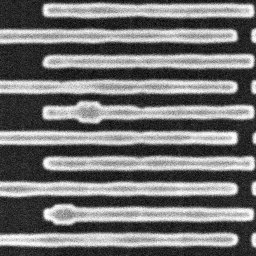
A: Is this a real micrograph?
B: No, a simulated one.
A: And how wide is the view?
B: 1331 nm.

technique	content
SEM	wiring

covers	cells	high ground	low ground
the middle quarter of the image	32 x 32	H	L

LLLHHHHHHHHHHHHHHHLLHHHHLLHHHHHH
LLLLLLLLLLLLLLLLLLLLLLLLLLLLLLLL
LLLLLLLLLLLLLLLLLLLLLLLLLLLLLLLL
LLLLLLLLLLLLLLLLLLLLLLLLLLLLLLLL
LLLLLLLLLLLLLLLLLLLLLLLLLLLLLLLL
HHHHHHHHHHHHHHHHHHHHHHHHHHHHHHHH
HHHHHHHHHHHHHHHHHHHHHHHHHHHHHHHH
LLLLLLLLLLLLLLLLLLLLLLLLLLLLLLLL
LLLLLLLLLLLLLLLLLLLLLLLLLLLLLLLL
LLLLLLLLLLLLLLLLLLLLLLLLLLLLLLLL
LLLHHHHHHLLLLLLLLLLLLLLLLLLLLLLL
HHHHHHHHHHHHHHHHHHHHHHHHHHHHHHHH
HHHHHHHHHHHHHHHHHHHHHHHHHHHHHHHH
LLLLHHHHHLLLLLLLLLLLLLLLLLLLLLLL
LLLLLLLLLLLLLLLLLLLLLLLLLLLLLLLL
LLLLLLLLLLLLLLLLLLLLLLLLLLLLLLLL
LLLLLLLLLLLLLLLLLLLLLLLLLLLLLLLL
HHHHHHHHHHHHHHHHHHHLHHHHHHHHHHHH
HHHHHHHHHHHHHHHHHHHHHHHHHHHHHHHH
HHHHHHHHHHHHHHHHHHLLHHHHHHHHHHHH
LLLLLLLLLLLLLLLLLLLLLLLLLLLLLLLL
LLLLLLLLLLLLLLLLLLLLLLLLLLLLLLLL
LLLLLLLLLLLLLLLLLLLLLLLLLLLLLLLL
LLLLLLLLLLLLLLLLLLLLLLLLLLLLLLLL
HHHHHHHHHHHHHHHHHHHHHHHHHHHHHHHH
HHHHHHHHHHHHHHHHHHHHHHHHHHHHHHHH
LLLLLLLLLLLLLLLLLLLLLLLLLLLLLLLL
LLLLLLLLLLLLLLLLLLLLLLLLLLLLLLLL
LLLLLLLLLLLLLLLLLLLLLLLLLLLLLLLL
LLLLLLLLLLLLLLLLLLLLLLLLLLLLLLLL
HHHHHHHHHHHHHHHHHHHHHHHHHHHHHHHH
HHHHHHHHHHHHHHHHHHHHHHHHHHHHHHHH